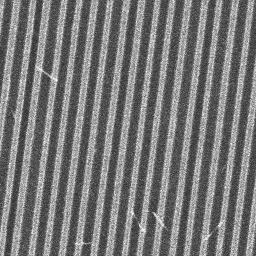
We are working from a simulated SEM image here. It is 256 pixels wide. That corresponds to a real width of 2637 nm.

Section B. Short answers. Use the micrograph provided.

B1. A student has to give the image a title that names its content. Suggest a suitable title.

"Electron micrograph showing parallel lines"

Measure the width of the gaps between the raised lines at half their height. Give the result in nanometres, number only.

81.7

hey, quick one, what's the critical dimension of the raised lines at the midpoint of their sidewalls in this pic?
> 71.5 nm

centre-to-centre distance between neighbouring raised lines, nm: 159